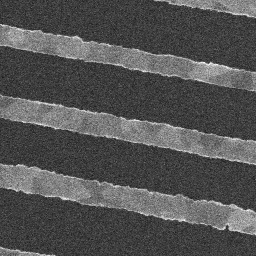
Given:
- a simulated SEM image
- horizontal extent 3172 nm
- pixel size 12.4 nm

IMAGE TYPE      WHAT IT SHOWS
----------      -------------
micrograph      one or a few lines or trenches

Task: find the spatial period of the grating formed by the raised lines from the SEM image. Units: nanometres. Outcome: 856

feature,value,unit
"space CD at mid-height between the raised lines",609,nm